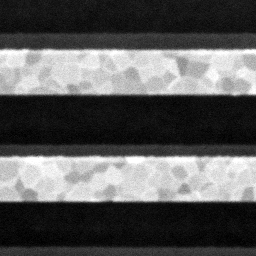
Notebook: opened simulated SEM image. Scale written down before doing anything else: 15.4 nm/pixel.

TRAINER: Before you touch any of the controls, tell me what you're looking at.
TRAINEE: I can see lines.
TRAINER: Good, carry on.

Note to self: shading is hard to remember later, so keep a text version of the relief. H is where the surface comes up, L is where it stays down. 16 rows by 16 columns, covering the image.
LLLLLLLLLLLLLLLL
LLLLLLLLLLLLLLLL
HHHHHHHHHHHHHHHH
HHHHHHHHHHHHHHHH
HHHHHHHHHHHHHHHH
HHHHHHHHHHHHHHHH
LLLLLLLLLLLLLLLL
LLLLLLLLLLLLLLLL
LLLLLLLLLLLLLLLL
HHHHHHHHHHHHHHHH
HHHHHHHHHHHHHHHH
HHHHHHHHHHHHHHHH
HHHHHHHHHHHHHHHH
LLLLLLLLLLLLLLLL
LLLLLLLLLLLLLLLL
HHHHHHHLLLLLHHLL